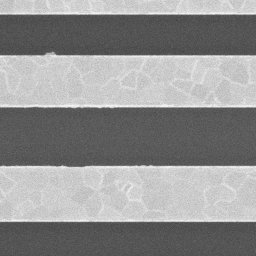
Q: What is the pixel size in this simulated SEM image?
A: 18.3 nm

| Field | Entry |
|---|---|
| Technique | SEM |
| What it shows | lines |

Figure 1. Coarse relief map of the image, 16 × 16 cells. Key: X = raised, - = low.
XXXXXXXXXXXXXXXX
----------------
----------------
----------------
XXXXXXXXXXXXXXXX
XXXXXXXXXXXXXXXX
XXXXXXXXXXXXXXXX
----------------
----------------
----------------
XXXXXXXXXXXXXXXX
XXXXXXXXXXXXXXXX
XXXXXXXXXXXXXXXX
XXXXXXXXXXXXXXXX
----------------
----------------